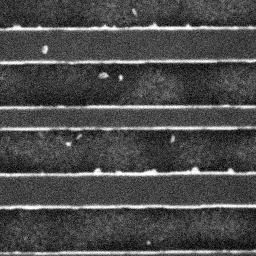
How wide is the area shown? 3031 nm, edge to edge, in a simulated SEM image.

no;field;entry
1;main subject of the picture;lines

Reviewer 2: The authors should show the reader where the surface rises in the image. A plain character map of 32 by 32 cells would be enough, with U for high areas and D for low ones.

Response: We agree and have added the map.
DDDDDDDDDDDDDDDDDDDDDDDDDDDDDDDD
DDDDDDDDDDDDDDDDDDDDDDDDDDDDDDDD
DDDDDDDDDDDDDDDDDDDDDDDDDDDDDDDD
DDDDDDDDDDDUUUDDUUUUUUUUUUUUUUUU
UUUUUUUUUUUUUUUUUUUUUUUUUUUUUUUU
UUUUUUUUUUUUUUUUUUUUUUUUUUUUUUUU
UUUUUUUUUUUUUUUUUUUUUUUUUUUUUUUU
UUUUUUUUUUUUUUUUUUUUUUUUUUUUUUUU
DDDDDDDDDDDDDDDDDDDDDDDDDDDDDDDD
DDDDDDDDDDDDDDDDDDDDDDDDDDDDDDDD
DDDDDDDDDDDDDDDDDDDDDDDDDDDDDDDD
DDDDDDDDDDDDDDDDDDDDDDDDDDDDDDDD
DDDDDDDDDDDDDDDDDDDDDDDDDDDDDDDD
UUUUUUUUUUUUUUUUUUUUUUUUUUUUUUUU
UUUUUUUUUUUUUUUUUUUUUUUUUUUUUUUU
UUUUUUUUUUUUUUUUUUUUUUUUUUUUUUUU
DDDDDDDDDDDDDDDDDDDDDDDDDDDDDDDD
DDDDDDDDDDDDDDDDDDDDDDDDDDDDDDDD
DDDDDDDDDDDDDDDDDDDDDDDDDDDDDDDD
DDDDDDDDDDDDDDDDDDDDDDDDDDDDDDDD
DDDDDDDDDDDDDDDDDDDDDDDDDDDDDDDD
DDDDDDDDDDDDDDDDDDDDDDDDDDDDDDDD
UUUUUUUUUUUUUUUUUUUUUUUUUUUUUUUU
UUUUUUUUUUUUUUUUUUUUUUUUUUUUUUUU
UUUUUUUUUUUUUUUUUUUUUUUUUUUUUUUU
UUUUUUUUUUUUUUUUUUUUUUUUUUUUUUUU
DDDDDDDDDDDDDDDDDDDDDDDDDDDDDDDD
DDDDDDDDDDDDDDDDDDDDDDDDDDDDDDDD
DDDDDDDDDDDDDDDDDDDDDDDDDDDDDDDD
DDDDDDDDDDDDDDDDDDDDDDDDDDDDDDDD
DDDDDDDDDDDDDDDDDDDDDDDDDDDDDDDD
DDDDDDDDDDDDDDDDDDDDUUUUUUUUUUUU